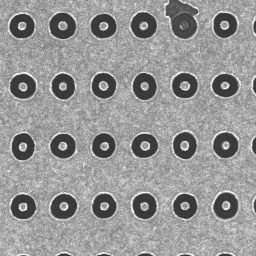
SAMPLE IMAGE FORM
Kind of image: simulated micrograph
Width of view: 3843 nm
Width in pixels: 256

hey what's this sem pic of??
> a regular array of ring-shaped grooves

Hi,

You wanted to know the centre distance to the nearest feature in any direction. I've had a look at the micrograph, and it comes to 607 nm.